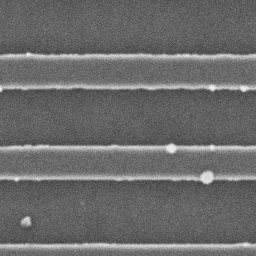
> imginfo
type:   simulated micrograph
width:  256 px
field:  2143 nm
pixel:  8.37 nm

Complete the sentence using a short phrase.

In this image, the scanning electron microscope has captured lines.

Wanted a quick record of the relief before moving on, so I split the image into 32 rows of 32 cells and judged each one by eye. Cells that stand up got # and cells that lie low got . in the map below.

................................
................................
................................
................................
................................
................................
................................
################################
################################
################################
################################
................................
................................
................................
................................
................................
................................
................................
################################
################################
################################
################################
.........................##.....
................................
................................
................................
................................
................................
................................
................................
..........#####........#.....###
################################